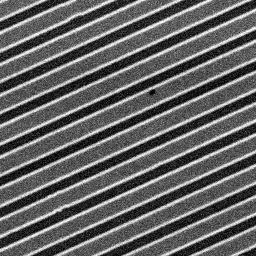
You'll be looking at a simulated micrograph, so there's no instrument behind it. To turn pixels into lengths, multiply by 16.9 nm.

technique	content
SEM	parallel lines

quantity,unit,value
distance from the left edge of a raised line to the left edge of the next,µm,0.476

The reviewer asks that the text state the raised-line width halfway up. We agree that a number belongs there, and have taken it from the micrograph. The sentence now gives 0.288 micrometres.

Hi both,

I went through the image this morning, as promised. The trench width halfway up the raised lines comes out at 0.186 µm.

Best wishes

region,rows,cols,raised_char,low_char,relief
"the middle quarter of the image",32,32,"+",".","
++++++++++.......++++++++++.....
++++++++.......++++++++++.......
++++++......+++++++++++......+++
+++.......+++++++++++......+++++
+.......+++++++++++......+++++++
......++++++++++.......+++++++++
....++++++++++.......++++++++++.
.+++++++++++......+++++++++++...
++++++++++......+++++++++++.....
++++++++......+++++++++++......+
+++++.......++++++++++.......+++
+++.......++++++++++.......+++++
+......+++++++++++......++++++++
.....+++++++++++......++++++++++
...+++++++++++......+++++++++++.
.++++++++++.......++++++++++....
+++++++++.......++++++++++......
+++++++......+++++++++++.......+
+++++......+++++++++++.......+++
+++......+++++++++++......++++++
.......++++++++++.......++++++++
.....++++++++++.......++++++++++
..+++++++++++.......++++++++++..
+++++++++++.......++++++++++....
+++++++++......+++++++++++......
++++++.......++++++++++.......++
++++.......++++++++++.......++++
++.......++++++++++.......++++++
.......++++++++++.......++++++++
....+++++++++++......+++++++++++
..++++++++++.......++++++++++...
++++++++++.......++++++++++.....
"